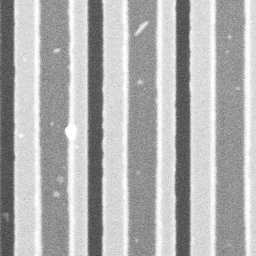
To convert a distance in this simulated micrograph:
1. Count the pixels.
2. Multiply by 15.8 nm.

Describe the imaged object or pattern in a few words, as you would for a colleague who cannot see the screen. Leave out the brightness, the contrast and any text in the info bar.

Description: lines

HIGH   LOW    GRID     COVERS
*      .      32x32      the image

..***....**..***....**..***....*
..***....**..***....**..***....*
..***....**..***....**..***....*
..***....**..***....**..***....*
..***....**..***....**..***....*
..***....**..***....**..***....*
..***....**..***....**..***....*
..***....**..***....**..***....*
..***....**..***....**..***....*
..***....**..***....**..***....*
..***....**..***....**..***....*
..***....**..***....**..***....*
..***....**..***....**..***....*
..***....**..***....**..***....*
..***....**..***....**..***....*
..***....**..***....**..***....*
..***...***..***....**..***....*
..***....**..***....**..***....*
..***....**..***....**..***....*
..***....**..***....**..***....*
..***....**..***....**..***....*
..***....**..***....**..***....*
..***....**..***....**..***....*
..***....**..***....**..***....*
..***....**..***....**..***....*
..***....**..***....**..***....*
..***....**..***....**..***....*
..***....**..***....**..***....*
..***....**..***....**..***....*
..***....**..***....**..***....*
..***....**..***....**..***....*
..***....**..***....**..***....*